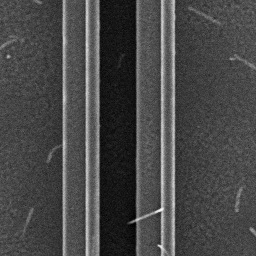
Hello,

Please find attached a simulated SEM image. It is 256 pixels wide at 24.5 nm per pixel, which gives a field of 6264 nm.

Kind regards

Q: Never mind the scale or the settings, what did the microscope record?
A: lines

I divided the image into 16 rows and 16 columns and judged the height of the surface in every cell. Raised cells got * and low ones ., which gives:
....**...**.....
....**...**.....
....**...**.....
....**...**.....
....**...**.....
....**...**.....
....**...**.....
....**...**.....
....**...**.....
....**...**.....
....**...**.....
....**...**.....
....**...**.....
....**...**.....
....**...**.....
....**...**.....